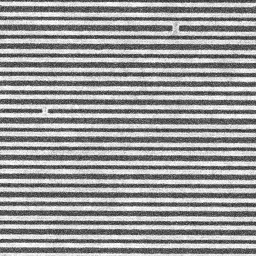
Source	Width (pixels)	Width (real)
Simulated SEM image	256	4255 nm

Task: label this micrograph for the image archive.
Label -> parallel lines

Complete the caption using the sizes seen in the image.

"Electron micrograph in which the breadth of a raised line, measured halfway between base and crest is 58.2 nm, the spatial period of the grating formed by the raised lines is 9.27 pixels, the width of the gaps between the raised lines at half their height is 102 nm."